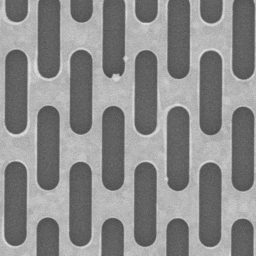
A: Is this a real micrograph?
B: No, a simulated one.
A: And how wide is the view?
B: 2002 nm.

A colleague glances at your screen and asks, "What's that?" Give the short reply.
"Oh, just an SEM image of groups of lines, slits or small figures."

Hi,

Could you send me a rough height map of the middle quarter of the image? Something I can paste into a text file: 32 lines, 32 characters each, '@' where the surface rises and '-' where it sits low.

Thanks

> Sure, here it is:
@------@@------@@-------@@------
@------@@@-----@@-------@@-----@
@------@@@-----@@-------@@-----@
@------@@@@-@@@@@-------@@@---@@
@------@@@@@@@@@@-------@@@@@@@@
@------@@@@@@@@@@-------@@@@@@@@
@------@@@@@@@@@@-------@@@@@@@@
@------@@@@@@@@@@-------@@@@@@@@
@------@@@@@@@@@@-------@@@@@@@@
@------@@@@@@@@@@-------@@@@@@@@
@------@@@@@-@@@@-------@@@@-@@@
@------@@@-----@@-------@@-----@
@------@@------@@-------@------@
@------@@------@@-------@-------
@------@@------@@-------@-------
@@-----@@------@@@------@-------
@@----@@@------@@@-----@@-------
@@@---@@@------@@@@---@@@-------
@@@@@@@@@------@@@@@@@@@@-------
@@@@@@@@@------@@@@@@@@@@-------
@@@@@@@@@------@@@@@@@@@@-------
@@@@@@@@@------@@@@@@@@@@-------
@@@@@@@@@------@@@@@@@@@@-------
@@@@@@@@@------@@@@@@@@@@-------
@@@--@@@@------@@@@@-@@@@-------
@@----@@@------@@@-----@@------@
@------@@------@@@-----@@------@
@------@@------@@------@@------@
@------@@------@@------@@@-----@
@------@@------@@------@@@-----@
@------@@@-----@@------@@@-----@
@------@@@@---@@@------@@@@---@@